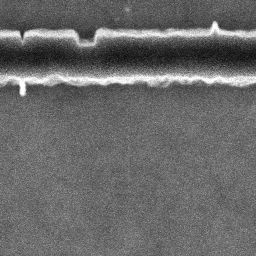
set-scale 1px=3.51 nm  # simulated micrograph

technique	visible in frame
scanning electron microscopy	one or a few lines or trenches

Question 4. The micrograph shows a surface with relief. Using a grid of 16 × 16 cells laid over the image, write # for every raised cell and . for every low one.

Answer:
................
................
#####.##########
################
################
................
................
................
................
................
................
................
................
................
................
................